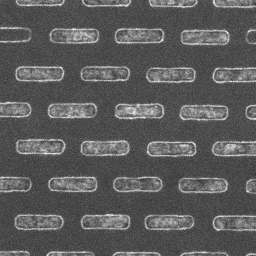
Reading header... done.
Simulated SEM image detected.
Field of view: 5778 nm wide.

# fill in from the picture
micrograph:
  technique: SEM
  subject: a regular array of holes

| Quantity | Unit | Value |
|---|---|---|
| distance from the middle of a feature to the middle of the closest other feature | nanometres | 1100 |